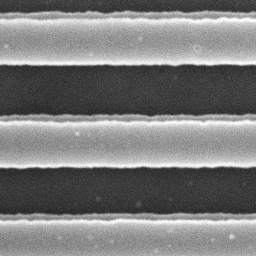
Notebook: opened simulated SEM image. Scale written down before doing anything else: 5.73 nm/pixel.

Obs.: lines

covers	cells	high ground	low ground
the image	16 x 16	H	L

LLLLLLLLLLLLLLLL
HHHHHHHHHHHHHHHH
HHHHHHHHHHHHHHHH
HHHHHHHHHHHHHHHH
LLLLLLLLLLLLLLLL
LLLLLLLLLLLLLLLL
LLLLLLLLLLLLLLLL
HHHHHHHHHHHHHHHH
HHHHHHHHHHHHHHHH
HHHHHHHHHHHHHHHH
LLLLLLLLLLLLLLLL
LLLLLLLLLLLLLLLL
LLLLLLLLLLLLLLLL
HHHHHHHHHHHHHHHH
HHHHHHHHHHHHHHHH
HHHHHHHHHHHHHHHH